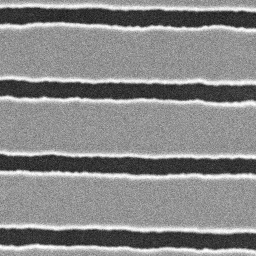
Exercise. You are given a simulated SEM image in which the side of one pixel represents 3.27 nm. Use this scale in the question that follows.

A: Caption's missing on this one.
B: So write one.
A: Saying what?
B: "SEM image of lines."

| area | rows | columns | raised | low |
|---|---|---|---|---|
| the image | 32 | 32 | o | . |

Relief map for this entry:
oooooooooooooooooooooooooooooooo
................................
................................
oooooooooooooooooooooo...ooooo..
oooooooooooooooooooooooooooooooo
oooooooooooooooooooooooooooooooo
oooooooooooooooooooooooooooooooo
oooooooooooooooooooooooooooooooo
oooooooooooooooooooooooooooooooo
oooooooooooooooooooooooooooooooo
..........................oooooo
................................
ooooooooooooooo.oooo....o.......
oooooooooooooooooooooooooooooooo
oooooooooooooooooooooooooooooooo
oooooooooooooooooooooooooooooooo
oooooooooooooooooooooooooooooooo
oooooooooooooooooooooooooooooooo
oooooooooooooooooooooooooooooooo
...o....oooooooooooooooooooooooo
................................
o.oo............................
oooooooooooooooooooooooooooooooo
oooooooooooooooooooooooooooooooo
oooooooooooooooooooooooooooooooo
oooooooooooooooooooooooooooooooo
oooooooooooooooooooooooooooooooo
oooooooooooooooooooooooooooooooo
..o.oooooooooooooooooooooooooooo
................................
................................
oooooooooooooooooooooooooooooooo